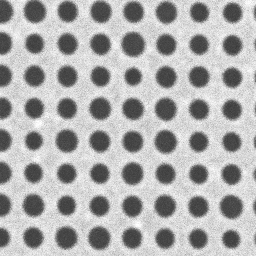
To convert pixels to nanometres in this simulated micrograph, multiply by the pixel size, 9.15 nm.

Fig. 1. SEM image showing a regular array of holes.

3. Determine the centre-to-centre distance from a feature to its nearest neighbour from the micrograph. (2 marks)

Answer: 294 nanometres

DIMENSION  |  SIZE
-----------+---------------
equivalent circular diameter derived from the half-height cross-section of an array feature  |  196 nm